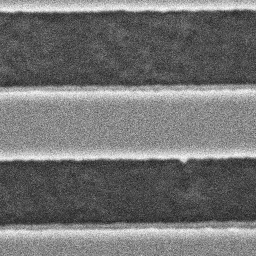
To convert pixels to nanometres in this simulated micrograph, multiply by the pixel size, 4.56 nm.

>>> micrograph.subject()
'lines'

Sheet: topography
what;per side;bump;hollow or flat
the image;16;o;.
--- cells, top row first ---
oooooooooooooooo
................
................
................
................
..oooooooooooooo
oooooooooooooooo
oooooooooooooooo
oooooooooooooooo
oooooooooooooooo
................
................
................
................
oooooooooooooooo
oooooooooooooooo